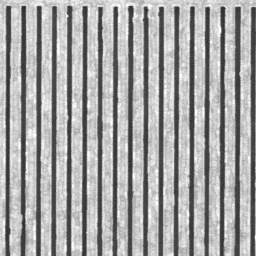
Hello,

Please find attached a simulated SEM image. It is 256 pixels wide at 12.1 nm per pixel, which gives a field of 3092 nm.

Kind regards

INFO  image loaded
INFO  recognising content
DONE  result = parallel lines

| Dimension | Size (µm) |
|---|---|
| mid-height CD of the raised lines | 0.115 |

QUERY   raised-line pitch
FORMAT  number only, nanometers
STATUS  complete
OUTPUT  185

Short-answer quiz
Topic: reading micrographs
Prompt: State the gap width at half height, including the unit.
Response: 68 nm